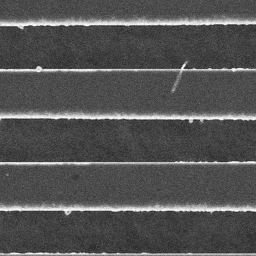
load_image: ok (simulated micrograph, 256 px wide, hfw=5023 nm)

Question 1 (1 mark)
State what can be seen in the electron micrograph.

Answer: lines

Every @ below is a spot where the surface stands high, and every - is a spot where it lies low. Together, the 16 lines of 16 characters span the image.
@@@@@@@@@@@@@@@@
@@@@@@@@@-------
----------------
----------------
@@@@@@@@@@@@@@@@
@@@@@@@@@@@@@@@@
@@@@@@@@@@@@@@@@
----------------
----------------
----------------
@@@@@@@@@@@@@@@@
@@@@@@@@@@@@@@@@
@@@@@@@@@@@@@@@@
----------------
----------------
----------------